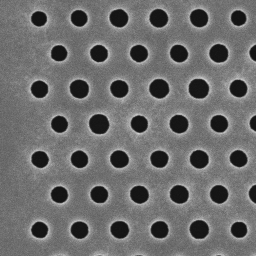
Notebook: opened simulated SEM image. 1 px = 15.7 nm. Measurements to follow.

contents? a regular array of holes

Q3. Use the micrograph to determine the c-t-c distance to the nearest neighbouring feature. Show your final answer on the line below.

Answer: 625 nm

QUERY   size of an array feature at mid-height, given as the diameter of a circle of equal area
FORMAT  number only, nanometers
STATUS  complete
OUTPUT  287